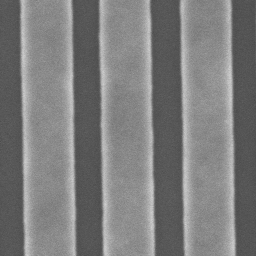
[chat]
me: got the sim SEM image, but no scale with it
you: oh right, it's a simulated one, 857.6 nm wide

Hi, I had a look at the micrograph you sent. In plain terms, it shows lines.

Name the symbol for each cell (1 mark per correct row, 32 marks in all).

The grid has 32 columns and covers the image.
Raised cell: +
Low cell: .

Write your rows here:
...++++++...+++++++....++++++...
...++++++...+++++++....++++++...
...++++++...+++++++....++++++...
...++++++...+++++++....++++++...
...++++++...+++++++....++++++...
...++++++...+++++++....++++++...
...++++++...+++++++....++++++...
...++++++...+++++++....++++++...
...++++++....++++++....++++++...
...++++++....++++++....++++++...
...++++++....++++++....++++++...
...++++++....++++++....++++++...
...++++++....++++++....++++++...
...++++++....++++++....++++++...
...++++++....++++++....++++++...
...++++++....++++++....++++++...
...++++++....++++++....++++++...
...++++++....++++++....++++++...
...++++++....++++++....++++++...
...++++++....++++++....++++++...
...++++++....++++++....++++++...
...++++++....++++++....++++++...
...++++++....++++++....++++++...
...++++++....++++++....++++++...
...++++++....++++++....++++++...
...++++++....++++++....++++++...
...++++++....++++++....++++++...
...++++++....++++++....++++++...
...++++++....++++++....++++++...
...++++++....++++++....++++++...
...++++++....++++++....++++++...
...++++++....++++++....++++++...